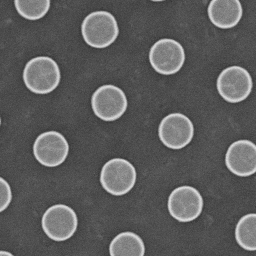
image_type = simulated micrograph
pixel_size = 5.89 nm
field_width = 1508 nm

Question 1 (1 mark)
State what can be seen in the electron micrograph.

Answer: a regular array of raised bodies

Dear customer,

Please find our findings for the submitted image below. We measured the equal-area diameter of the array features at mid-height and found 0.206 microns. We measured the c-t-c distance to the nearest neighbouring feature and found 72.5 pixels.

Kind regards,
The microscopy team